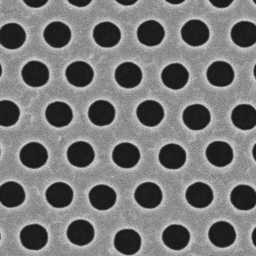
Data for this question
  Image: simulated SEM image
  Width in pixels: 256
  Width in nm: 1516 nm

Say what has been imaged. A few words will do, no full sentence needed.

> a regular array of holes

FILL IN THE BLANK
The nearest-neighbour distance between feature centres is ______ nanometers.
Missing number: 263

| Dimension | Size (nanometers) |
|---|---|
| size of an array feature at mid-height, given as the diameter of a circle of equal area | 160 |